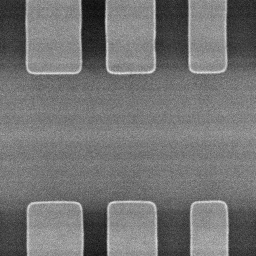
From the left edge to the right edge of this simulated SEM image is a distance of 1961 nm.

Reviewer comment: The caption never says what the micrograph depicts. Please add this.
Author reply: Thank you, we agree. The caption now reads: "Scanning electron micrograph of groups of lines, slits or small figures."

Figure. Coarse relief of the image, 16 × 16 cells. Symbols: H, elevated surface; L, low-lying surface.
LLHHHLLHHHLLHHLL
LLHHHLLHHHLLHHLL
LLHHHLLHHHLLHHLL
LLHHHLLHHHLLHHLL
LLHHHLLHHLLLHHLL
LLLLLLLLLLLLLLLL
LLLLLLLLLLLLLLLL
LLLLLLLLLLLLLLLL
LLLLLLLLLLLLLLLL
LLLLLLLLLLLLLLLL
LLLLLLLLLLLLLLLL
LLLLLLLLLLLLLLLL
LLLLLLLLLLLLLLLL
LLHHHLLHHHLLHHLL
LLHHHLLHHHLLHHLL
LLHHHLLHHHLLHHLL